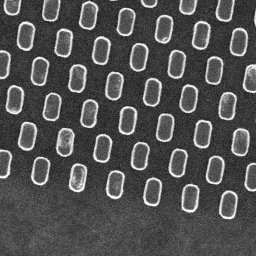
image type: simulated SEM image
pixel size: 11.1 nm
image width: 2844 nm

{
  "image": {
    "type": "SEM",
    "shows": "a regular array of raised bodies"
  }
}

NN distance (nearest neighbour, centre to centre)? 414 nm